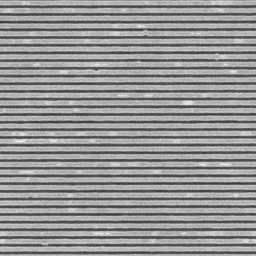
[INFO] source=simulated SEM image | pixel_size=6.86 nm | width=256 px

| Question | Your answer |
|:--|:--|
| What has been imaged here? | parallel lines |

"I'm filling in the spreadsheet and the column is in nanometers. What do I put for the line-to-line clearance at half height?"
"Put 19.7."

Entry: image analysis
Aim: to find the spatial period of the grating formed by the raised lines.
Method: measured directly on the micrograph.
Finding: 52.8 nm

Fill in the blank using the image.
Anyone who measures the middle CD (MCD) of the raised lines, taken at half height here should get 31.7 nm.